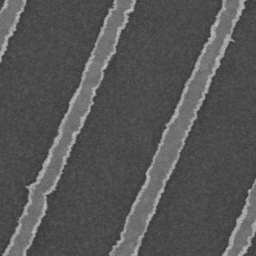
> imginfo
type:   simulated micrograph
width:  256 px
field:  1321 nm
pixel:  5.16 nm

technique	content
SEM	one or a few lines or trenches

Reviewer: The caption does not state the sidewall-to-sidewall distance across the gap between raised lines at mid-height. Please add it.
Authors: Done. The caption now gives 415 nanometres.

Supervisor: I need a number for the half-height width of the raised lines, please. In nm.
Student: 103